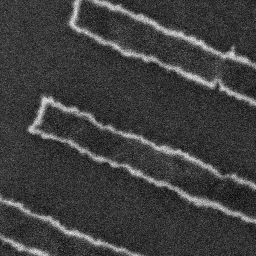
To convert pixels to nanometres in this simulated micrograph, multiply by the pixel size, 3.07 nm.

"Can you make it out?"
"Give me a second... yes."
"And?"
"one or a few lines or trenches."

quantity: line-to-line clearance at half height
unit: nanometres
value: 232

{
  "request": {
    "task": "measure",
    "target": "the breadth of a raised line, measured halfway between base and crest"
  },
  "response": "34.8 pixels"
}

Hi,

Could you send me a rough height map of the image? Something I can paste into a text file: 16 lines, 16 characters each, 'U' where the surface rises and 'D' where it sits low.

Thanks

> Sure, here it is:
DDDDDUUDDDDDDDDD
DDDDDUUUUUDDDDDD
DDDDDDUUUUUUDDDD
DDDDDDDDDUUUUUUD
DDDDDDDDDDDUUUUU
DDDDDDDDDDDDDDUU
DDDUDDDDDDDDDDDD
DDUUUUDDDDDDDDDD
DDDUUUUUDDDDDDDD
DDDDDUUUUUUDDDDD
DDDDDDDDUUUUUDDD
DDDDDDDDDDUUUUUU
DDDDDDDDDDDDUUUU
UUDDDDDDDDDDDDDU
UUUUDDDDDDDDDDDD
DUUUUUUDDDDDDDDD